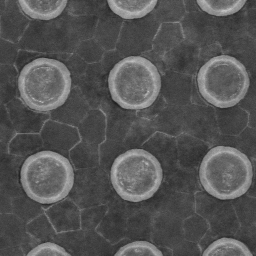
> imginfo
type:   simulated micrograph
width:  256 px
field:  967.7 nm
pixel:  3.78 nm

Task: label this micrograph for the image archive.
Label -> raised bodies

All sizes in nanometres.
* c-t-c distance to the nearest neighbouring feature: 338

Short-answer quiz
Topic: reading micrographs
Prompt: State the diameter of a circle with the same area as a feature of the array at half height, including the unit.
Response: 181 nm